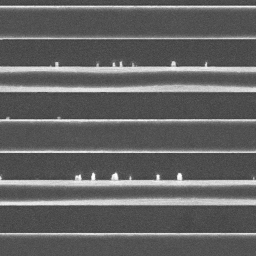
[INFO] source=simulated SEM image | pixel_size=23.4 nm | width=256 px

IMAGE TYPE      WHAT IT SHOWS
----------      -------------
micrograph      lines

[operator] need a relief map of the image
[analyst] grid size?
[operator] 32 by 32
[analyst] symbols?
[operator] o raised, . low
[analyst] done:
................................
oooooooooooooooooooooooooooooooo
oooooooooooooooooooooooooooooooo
oooooooooooooooooooooooooooooooo
oooooooooooooooooooooooooooooooo
................................
................................
................................
................................
oooooooooooooooooooooooooooooooo
oooooooooooooooooooooooooooooooo
................................
................................
................................
................................
oooooooooooooooooooooooooooooooo
oooooooooooooooooooooooooooooooo
oooooooooooooooooooooooooooooooo
oooooooooooooooooooooooooooooooo
................................
................................
................................
................................
oooooooooooooooooooooooooooooooo
oooooooooooooooooooooooooooooooo
................................
................................
................................
................................
oooooooooooooooooooooooooooooooo
oooooooooooooooooooooooooooooooo
oooooooooooooooooooooooooooooooo